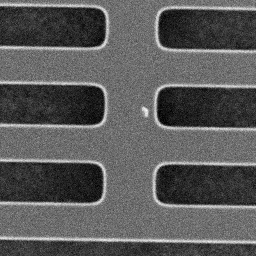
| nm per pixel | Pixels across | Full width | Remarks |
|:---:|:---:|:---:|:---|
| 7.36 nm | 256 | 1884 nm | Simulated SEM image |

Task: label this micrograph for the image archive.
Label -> groups of lines, slits or small figures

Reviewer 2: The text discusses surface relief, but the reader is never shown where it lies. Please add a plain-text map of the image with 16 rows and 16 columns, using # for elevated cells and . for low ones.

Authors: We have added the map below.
......##########
.......###......
.......###......
################
################
......####......
.......###......
......####......
################
################
......####......
......####......
......####......
################
################
................